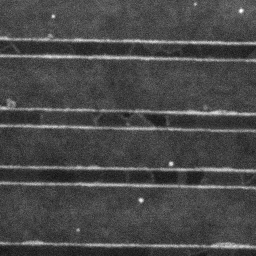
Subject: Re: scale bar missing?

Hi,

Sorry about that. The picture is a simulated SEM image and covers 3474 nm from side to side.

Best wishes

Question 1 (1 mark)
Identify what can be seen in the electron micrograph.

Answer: lines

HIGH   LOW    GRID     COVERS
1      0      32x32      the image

00000000000000000000000000000000
00000000000000000000000000000000
00000000000000000000000000000000
00000000000000000000000000000000
00000000000000000000000000000000
11111111111111111111111111111111
11111111111111111111111111111111
00000000000000000000000011111111
00000000000000000000000000000000
00000000000000000000000000000000
00000000000000000000000000000000
00000000000000000000000000000000
00000000000000000000000000000000
10000000000000000000000000000000
11111111111111111111111111111111
11111111111111111111111111111111
00000000000000000000000000000000
00000000000000000000000000000000
00000000000000000000000000000000
00000000000000000000000000000000
00000000000000000000000000000000
11111111111111111111111111111111
11111111111111111111111111111111
00000000000000000000000000000011
00000000000000000000000000000000
00000000000000000000000000000000
00000000000000000000000000000000
00000000000000000000000000000000
00000000000000000000000000000000
00000000000000000000000000000000
11111111100000000000000000000000
11111111111111111111111111111111